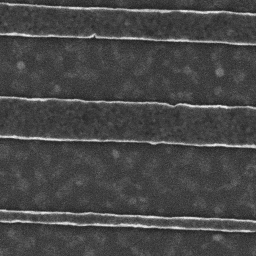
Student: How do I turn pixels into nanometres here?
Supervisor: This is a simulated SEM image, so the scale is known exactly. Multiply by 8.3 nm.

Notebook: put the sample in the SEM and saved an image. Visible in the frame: one or a few lines or trenches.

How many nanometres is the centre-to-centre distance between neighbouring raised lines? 816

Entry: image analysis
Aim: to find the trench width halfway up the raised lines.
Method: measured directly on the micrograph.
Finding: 565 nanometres